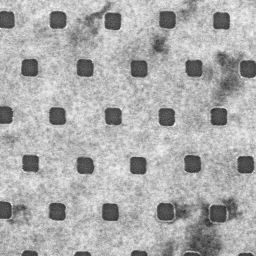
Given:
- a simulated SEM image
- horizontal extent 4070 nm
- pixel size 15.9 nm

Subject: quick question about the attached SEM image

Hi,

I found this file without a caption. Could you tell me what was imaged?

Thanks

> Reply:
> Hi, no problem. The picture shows a regular array of holes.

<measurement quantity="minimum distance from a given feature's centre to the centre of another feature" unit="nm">848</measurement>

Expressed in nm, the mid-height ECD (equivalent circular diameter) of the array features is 305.